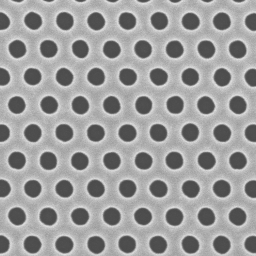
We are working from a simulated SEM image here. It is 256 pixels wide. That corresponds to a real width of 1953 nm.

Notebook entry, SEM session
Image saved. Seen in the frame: a regular array of holes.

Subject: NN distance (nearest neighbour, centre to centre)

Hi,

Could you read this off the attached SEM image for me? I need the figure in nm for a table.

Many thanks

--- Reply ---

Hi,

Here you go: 238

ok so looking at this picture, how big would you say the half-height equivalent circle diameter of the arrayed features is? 0.137 um